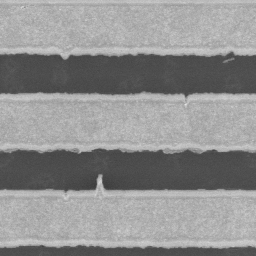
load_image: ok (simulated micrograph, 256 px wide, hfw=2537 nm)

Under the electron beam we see one or a few lines or trenches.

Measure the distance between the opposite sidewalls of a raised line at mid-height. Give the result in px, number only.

50.3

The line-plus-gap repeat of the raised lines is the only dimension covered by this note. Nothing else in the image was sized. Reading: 953 nanometres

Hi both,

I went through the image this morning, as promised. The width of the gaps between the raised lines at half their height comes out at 46.4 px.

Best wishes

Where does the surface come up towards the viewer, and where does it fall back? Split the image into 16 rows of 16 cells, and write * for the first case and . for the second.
****************
****************
****************
................
................
................
****************
****************
****************
................
................
................
****************
****************
****************
................